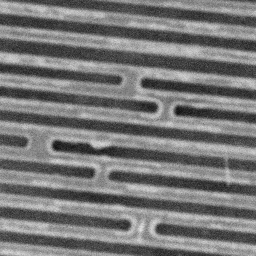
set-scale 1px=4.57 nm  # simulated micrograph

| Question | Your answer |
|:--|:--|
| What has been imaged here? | parallel lines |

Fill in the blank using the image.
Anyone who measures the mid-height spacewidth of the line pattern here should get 60.3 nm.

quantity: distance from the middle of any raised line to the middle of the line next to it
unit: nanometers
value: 110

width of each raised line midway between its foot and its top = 0.0484 um